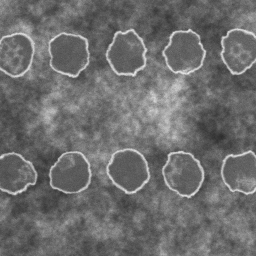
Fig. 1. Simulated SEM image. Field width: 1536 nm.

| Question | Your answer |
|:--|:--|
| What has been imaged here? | raised bodies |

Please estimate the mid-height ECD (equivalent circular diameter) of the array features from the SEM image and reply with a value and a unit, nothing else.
246 nanometres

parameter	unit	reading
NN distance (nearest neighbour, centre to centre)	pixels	57.5